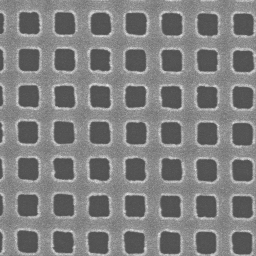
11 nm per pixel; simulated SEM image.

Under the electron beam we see a regular array of holes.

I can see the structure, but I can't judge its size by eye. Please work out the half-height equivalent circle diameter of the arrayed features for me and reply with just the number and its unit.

259 nanometers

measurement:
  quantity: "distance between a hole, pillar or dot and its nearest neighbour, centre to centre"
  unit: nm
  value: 391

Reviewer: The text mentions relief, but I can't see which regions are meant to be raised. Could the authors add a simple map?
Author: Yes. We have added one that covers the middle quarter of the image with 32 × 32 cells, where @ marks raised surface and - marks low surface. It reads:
---@@@-----@@@@------@@@------@@
--@@@@@----@@@@@----@@@@@----@@@
@@@@@@@@@@@@@@@@@@@@@@@@@@@@@@@@
@@@@@@@@@@@@@@@@@@@@@@@@@@@@@@@@
@@@@@@@@@@@@@@@@@@@@@@@@@@@@@@@@
--@@@@@-@-@@@@@@----@@@@@---@@@@
---@@@------@@@------@@@-----@@@
---@@@------@@@------@@@------@@
---@@@------@@@------@@@------@@
---@@@@-----@@@------@@@------@@
---@@@@-----@@@@----@@@@@----@@@
@@@@@@@@@@@@@@@@@@@@@@@@@@@@@@@@
@@@@@@@@@@@@@@@@@@@@@@@@@@@@@@@@
@@@@@@@@@@@@@@@@@@@@@@@@@@@@@@@@
--@@@@@---@@@@@@@-@@@@@@@---@@@@
---@@@@----@@@@------@@@-----@@@
---@@@------@@@------@@@-----@@@
---@@@------@@@------@@@-----@@@
---@@@------@@@------@@@-----@@@
--@@@@@-----@@@@----@@@@-----@@@
@@@@@@@@@@@@@@@@@@@@@@@@@@@@@@@@
@@@@@@@@@@@@@@@@@@@@@@@@@@@@@@@@
@@@@@@@@@@@@@@@@@@@@@@@@@@@@@@@@
--@@@@@---@@@@@@@@@@@@@@@@@@@@@@
--@@@@-----@@@@-----@@@@-----@@@
---@@@-----@@@@-----@@@@-----@@@
---@@@-----@@@@-----@@@@------@@
---@@@-----@@@@-----@@@@------@@
--@@@@-----@@@@-----@@@@@----@@@
@@@@@@@@@@@@@@@@@@@@@@@@@@@@@@@@
@@@@@@@@@@@@@@@@@@@@@@@@@@@@@@@@
@@@@@@@@@@@@@@@@@@@@@@@@@@@@@@@@